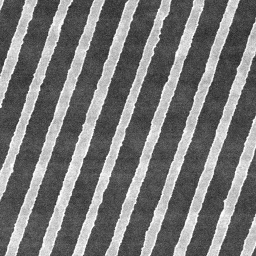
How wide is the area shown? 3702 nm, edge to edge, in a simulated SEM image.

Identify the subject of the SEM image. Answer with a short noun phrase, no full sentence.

parallel lines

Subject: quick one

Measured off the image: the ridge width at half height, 0.138 um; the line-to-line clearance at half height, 323 nm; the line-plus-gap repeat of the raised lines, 460 nm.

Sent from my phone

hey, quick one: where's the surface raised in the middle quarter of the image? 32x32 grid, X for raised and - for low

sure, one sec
--XX------XXX------XX------XXX--
-XXX------XXX-----XXX------XX---
-XXX------XX------XX-------XX---
-XX------XXX------XX------XXX---
XXX------XXX------XX------XX----
XXX-----XXX------XX------XXX----
XX------XXX------XX------XXX----
XX------XXX-----XXX------XX-----
XX-----XXX------XX------XXX-----
X------XXX------XX------XX------
X------XX------XXX------XX------
X-----XXX------XX------XXX------
------XXX------XX------XX------X
------XX------XXX-----XXX------X
-----XXX------XX------XXX------X
-----XXX------XX------XX-------X
-----XX------XX-------XX------XX
----XXX------XX------X-X------XX
----XXX-----XXX------XXX------XX
----XX------XX-------XX------XXX
---XXX------XX------XX-------XX-
---XXX------XX------XX------XXX-
--XXX------XX-------XX------XX--
--XXX------XX------XXX------XX--
--XXX-----XXX------XX------XXX--
-XXX------XX-------XX------XX---
-XXX------XX------XXX-----XXX---
-XXX-----XXX------XX------XXX---
XXX------XX-------XX------XX----
XXX------XX------XX------XXX----
XX------XXX------XX------XX-----
XX------XX------XXX------XX-----